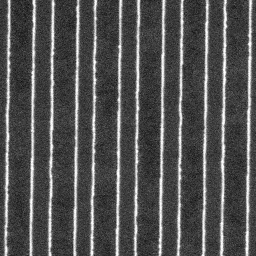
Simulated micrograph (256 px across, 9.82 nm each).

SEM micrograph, lines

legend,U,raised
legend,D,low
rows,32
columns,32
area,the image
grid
UDDDUUUDDDUUDDDUUDDDUUUDDDUUDDDU
UDDDUUUDDDUUDDDUUDDDUUUDDDUUDDDU
UDDDUUUDDDUUDDDUUDDDUUUDDDUUDDDU
UDDDUUUDDDUUDDDUUDDDUUUDDDUUDDDU
UDDDUUUDDDUUDDDUUDDDUUUDDDUUDDDU
UDDDUUUDDDUUDDDUUDDDUUUDDDUUDDDU
UDDDUUUDDDUUDDDUUDDDUUUDDDUUDDDU
UDDDUUUDDDUUDDDUUDDDUUUDDDUUDDDU
UDDDUUUDDDUUDDDUUDDDUUUDDDUUDDDU
UDDDUUUDDDUUDDDUUDDDUUUDDDUUDDDU
UDDDUUUDDDUUDDDUUDDDUUUDDDUUDDDU
UDDDUUUDDDUUDDDUUDDDUUUDDDUUDDDU
UDDDUUUDDDUUDDDUUDDDUUUDDDUUDDDU
UDDDUUUDDDUUDDDUUDDDUUUDDDUUDDDU
UDDDUUUDDDUUDDDUUDDDUUUDDDUUDDDU
UDDDUUUDDDUUDDDUUDDDUUUDDDUUDDDU
UDDDUUDDDDUUDDDUUDDDUUUDDDUUDDDU
UDDDUUDDDDUUDDDUUDDDUUUDDDUUDDDU
UDDDUUDDDDUUDDDUUDDDUUUDDDUUDDDU
UDDDUUDDDUUUDDDUUDDDUUUDDDUUDDDU
UDDDUUDDDUUUDDDUUDDDUUDDDDUUDDDU
UDDDUUDDDUUUDDDUUDDDUUUDDDUUDDDU
UDDDUUDDDUUUDDDUUDDDUUDDDDUUDDDU
UDDDUUDDDUUUDDDUUDDDUUDDDDUUDDDU
UDDDUUDDDUUUDDDUUDDDUUDDDDUUDDDU
UDDDUUDDDUUUDDDUUDDDUUDDDDUUDDDU
UDDDUUDDDUUUDDDUUDDDUUDDDUUUDDDU
UDDDUUDDDUUUDDDUUDDDUUDDDUUUDDDU
UDDDUUDDDUUUDDDUUDDDUUDDDUUUDDDU
UDDDUUDDDUUUDDDUUDDDUUDDDUUUDDDU
UDDDUUDDDUUUDDDUUDDDUUDDDUUUDDDU
UDDDUUDDDUUDDDDUUDDDUUDDDUUUDDDU